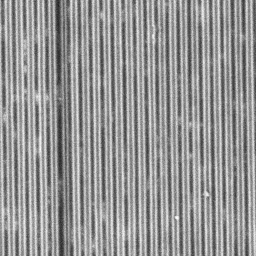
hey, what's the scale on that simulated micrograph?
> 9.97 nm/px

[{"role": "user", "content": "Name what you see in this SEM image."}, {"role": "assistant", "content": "parallel lines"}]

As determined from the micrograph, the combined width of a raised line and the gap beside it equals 109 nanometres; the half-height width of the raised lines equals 66.1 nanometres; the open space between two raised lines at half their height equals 37.4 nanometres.